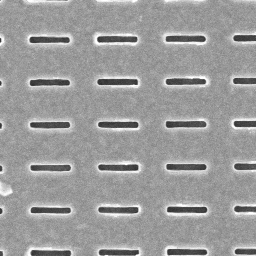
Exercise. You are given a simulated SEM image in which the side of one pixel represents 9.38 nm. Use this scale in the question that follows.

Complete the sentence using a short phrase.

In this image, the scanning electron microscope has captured a regular array of holes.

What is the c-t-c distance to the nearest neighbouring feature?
0.401 µm